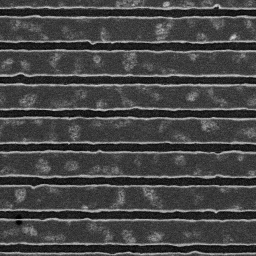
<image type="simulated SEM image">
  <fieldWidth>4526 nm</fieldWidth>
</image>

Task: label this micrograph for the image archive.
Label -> parallel lines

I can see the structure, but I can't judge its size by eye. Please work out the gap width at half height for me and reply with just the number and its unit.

141 nanometres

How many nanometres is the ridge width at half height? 455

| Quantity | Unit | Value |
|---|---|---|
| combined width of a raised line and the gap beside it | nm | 596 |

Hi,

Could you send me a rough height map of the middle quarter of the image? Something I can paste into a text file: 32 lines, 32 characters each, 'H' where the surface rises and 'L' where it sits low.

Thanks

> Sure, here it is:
HHHHHHHHHHHHHHHHHHHHHHHHHHHHHHHH
HHHHHHHHHHHHHHHHHHHHHHHHHHHHHHHH
HHHHHHHHHHHHHHHHHHHHHHHHHHHHHHHH
LLLLLLLLLLLLLLLLLLLLLLLLLLLLLLLL
LLLLLLLLLLLLLLLLLLLLLLLLLLLLLLLL
HHHHHHHHHHHHHHHHHHHHHHHHHHHHHHHH
HHHHHHHHHHHHHHHHHHHHHHHHHHHHHHHH
HHHHHHHHHHHHHHHHHHHHHHHHHHHHHHHH
HHHHHHHHHHHHHHHHHHHHHHHHHHHHHHHH
HHHHHHHHHHHHHHHHHHHHHHHHHHHHHHHH
HHHHHHHHHHHHHHHHHHHHHHHHHHHHHHHH
LLLLLLLHHHHLLLLLLLLLLLLLLLLLLLLL
LLLLLLLLLLLLLLLLLLLLLLLLLLLLLLLL
LLHHHHLHHLLLLHHHHHLLLLHHHHLLLLLH
HHHHHHHHHHHHHHHHHHHHHHHHHHHHHHHH
HHHHHHHHHHHHHHHHHHHHHHHHHHHHHHHH
HHHHHHHHHHHHHHHHHHHHHHHHHHHHHHHH
HHHHHHHHHHHHHHHHHHHHHHHHHHHHHHHH
HHHHHHHHHHHHHHHHHHHHHHHHHHHHHHHH
HHHHHHHHHHHHHHLHHHHHHHHHHHHHHHHH
LLLLLLLLLLLLLLLLLLLLLLLLLLLLLLLL
LLLLLLLLLLLLLLLLLLLLLLLLLLLLLLLL
HHHHHHHHHHHHHHHHHHHHHHHHHHHHHHHH
HHHHHHHHHHHHHHHHHHHHHHHHHHHHHHHH
HHHHHHHHHHHHHHHHHHHHHHHHHHHHHHHH
HHHHHHHHHHHHHHHHHHHHHHHHHHHHHHHH
HHHHHHHHHHHHHHHHHHHHHHHHHHHHHHHH
HHHHHHHHHHHHHHHHHHHHHHHHHHHHHHHH
LLLLLLLLLLLLLLLLLLLLLLLLLLLLLLLL
LLLLLLLLLLLLLLLLLLLLLLLLLLLLLLLL
LLLLLHHHHHHHLLLLHHLLLLLLHLLLLLLL
HHHHHHHHHHHHHHHHHHHHHHHHHHHHHHHH